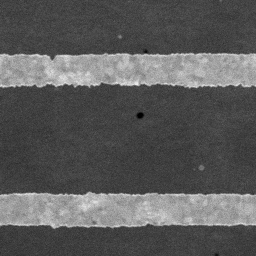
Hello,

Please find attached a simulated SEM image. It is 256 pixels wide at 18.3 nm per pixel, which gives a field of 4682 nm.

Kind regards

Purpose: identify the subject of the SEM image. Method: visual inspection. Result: one or a few lines or trenches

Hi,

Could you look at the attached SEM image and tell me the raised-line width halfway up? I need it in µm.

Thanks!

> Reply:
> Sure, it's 0.558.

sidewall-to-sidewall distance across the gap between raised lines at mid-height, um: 2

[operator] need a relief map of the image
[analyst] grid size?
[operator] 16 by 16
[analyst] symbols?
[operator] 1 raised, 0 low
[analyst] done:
0000000000000000
0000000000000000
0000000000000000
1110111111111111
1111111111111111
0000000000000000
0000000000000000
0000000000000000
0000000000000000
0000000000000000
0000000000000000
0000000000000000
1111111111111111
1111111111111111
0000000000000000
0000000000000000